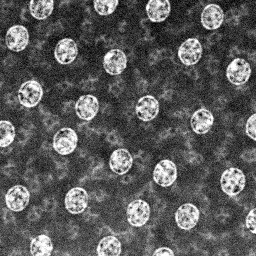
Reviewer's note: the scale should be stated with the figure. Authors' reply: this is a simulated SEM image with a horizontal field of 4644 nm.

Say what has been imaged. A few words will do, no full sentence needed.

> a regular array of raised bodies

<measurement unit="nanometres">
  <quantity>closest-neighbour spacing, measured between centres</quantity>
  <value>906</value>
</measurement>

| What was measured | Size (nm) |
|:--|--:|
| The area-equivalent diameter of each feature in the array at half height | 420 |